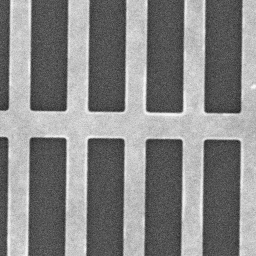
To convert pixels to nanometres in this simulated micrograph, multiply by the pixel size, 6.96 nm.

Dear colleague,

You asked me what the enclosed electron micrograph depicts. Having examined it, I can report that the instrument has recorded groups of lines, slits or small figures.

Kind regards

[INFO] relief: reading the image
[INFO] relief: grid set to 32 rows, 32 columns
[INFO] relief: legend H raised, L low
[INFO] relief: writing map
LHHHLLLLLHHLLLLLHHLLLLLHHHLLLLHH
LHHHLLLLLHHLLLLLHHLLLLLHHHLLLLHH
LHHHLLLLLHHLLLLLHHLLLLLHHHLLLLHH
LHHHLLLLLHHLLLLLHHLLLLLHHHLLLLHH
LHHHLLLLLHHLLLLLHHLLLLLHHHLLLLHH
LHHHLLLLLHHLLLLLHHLLLLLHHHLLLLHH
LHHHLLLLLHHLLLLLHHLLLLLHHHLLLLHH
LHHHLLLLLHHLLLLLHHLLLLLHHHLLLLHH
LHHHLLLLLHHLLLLLHHLLLLLHHHLLLLHH
LHHHLLLLHHHLLLLLHHLLLLLHHHLLLLHH
LHHHLLLLHHHLLLLLHHLLLLLHHHLLLLHH
LHHHLLLLHHHLLLLLHHLLLLLHHLLLLLHH
LHHHLLLLHHHLLLLLHHLLLLLHHLLLLLHH
LHHHLLLLHHHLLLLLHHLLLLLHHLLLLLHH
HHHHHHHHHHHHHHHHHHHHHHHHHHHHHHHH
HHHHHHHHHHHHHHHHHHHHHHHHHHHHHHHH
HHHHHHHHHHHHHHHHHHHHHHHHHHHHHHHH
LHHHLLLLHHHLLLLHHHLLLLLHHHLLLLHH
LHHHLLLLHHHLLLLLHHLLLLLHHLLLLLHH
LHHHLLLLHHHLLLLLHHLLLLLHHLLLLLHH
LHHHLLLLHHHLLLLLHHLLLLLHHLLLLLHH
LHHLLLLLHHHLLLLLHHLLLLLHHLLLLLHH
LHHLLLLLHHHLLLLLHHLLLLLHHLLLLLHH
LHHLLLLLHHHLLLLLHHLLLLLHHLLLLLHH
LHHLLLLLHHHLLLLLHHLLLLLHHLLLLLHH
LHHLLLLLHHHLLLLLHHLLLLLHHLLLLLHH
LHHLLLLLHHHLLLLLHHLLLLLHHLLLLLHH
LHHLLLLLHHHLLLLLHHLLLLLHHLLLLLHH
LHHLLLLLHHHLLLLLHHLLLLLHHLLLLLHH
LHHLLLLLHHHLLLLLHHLLLLLHHLLLLLHH
LHHLLLLLHHHLLLLLHHLLLLLHHLLLLLHH
LHHLLLLLHHHLLLLLHHLLLLLHHLLLLLHH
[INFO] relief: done